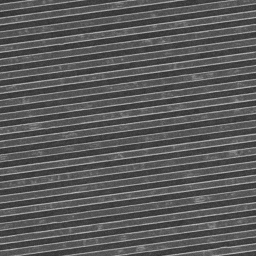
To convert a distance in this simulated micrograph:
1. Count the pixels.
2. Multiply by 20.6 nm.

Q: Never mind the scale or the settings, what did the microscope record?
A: parallel lines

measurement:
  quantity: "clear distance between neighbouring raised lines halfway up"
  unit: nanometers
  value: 138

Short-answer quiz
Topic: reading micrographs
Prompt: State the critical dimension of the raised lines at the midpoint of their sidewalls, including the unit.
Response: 138 nanometres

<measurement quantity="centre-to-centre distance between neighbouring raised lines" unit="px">13.6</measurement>